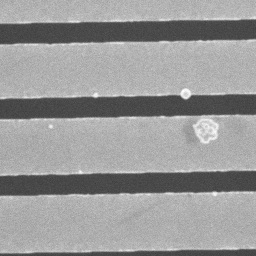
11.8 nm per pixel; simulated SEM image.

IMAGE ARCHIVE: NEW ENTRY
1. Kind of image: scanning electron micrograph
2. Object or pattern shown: lines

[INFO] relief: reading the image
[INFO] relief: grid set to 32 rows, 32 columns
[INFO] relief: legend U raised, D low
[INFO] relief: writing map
UUUUUUUUUUUUUUUUUUUUUUUUUUUUUUUU
UUUUUUUUUUUUUUUUUUUUUUUUUUUUUUUU
UUUUUUUUUUUUUUUUUUUUUUDDDDDDDDDD
DDDDDDDDDDDDDDDDDDDDDDDDDDDDDDDD
DDDDDDDDDDDDDDDDDDDDDDDDDDDDDDDD
DDDDDDDDUUUUUUUUUUUUUUUUUUUUUUUU
UUUUUUUUUUUUUUUUUUUUUUUUUUUUUUUU
UUUUUUUUUUUUUUUUUUUUUUUUUUUUUUUU
UUUUUUUUUUUUUUUUUUUUUUUUUUUUUUUU
UUUUUUUUUUUUUUUUUUUUUUUUUUUUUUUU
UUUUUUUUUUUUUUUUUUUUUUUUUUUUUUUU
UUUUUUUUUUUUUUUUUUUUUUUUUUUUUUUU
DDDDDDDDDDDDDDDDDDDDDDDDDDDDDDDD
DDDDDDDDDDDDDDDDDDDDDDDDDDDDDDDD
DDDDDDDDDDDDDDDDDDDDDDDDDUUUUUUU
UUUUUUUUUUUUUUUUUUUUUUUUUUUUUUUU
UUUUUUUUUUUUUUUUUUUUUUUUUUUUUUUU
UUUUUUUUUUUUUUUUUUUUUUUUUUUUUUUU
UUUUUUUUUUUUUUUUUUUUUUUUUUUUUUUU
UUUUUUUUUUUUUUUUUUUUUUUUUUUUUUUU
UUUUUUUUUUUUUUUUUUUUUUUUUUUUUUUU
UUUUUUUUUUUUUUUUUUDDDDDDDDDDDDDD
DDDDDDDDDDDDDDDDDDDDDDDDDDDDDDDD
DDDDDDDDDDDDDDDDDDDDDDDDDDDDDDDD
DDDDUUUUUUUUUUUUUUUUUUUUUUUUUUUU
UUUUUUUUUUUUUUUUUUUUUUUUUUUUUUUU
UUUUUUUUUUUUUUUUUUUUUUUUUUUUUUUU
UUUUUUUUUUUUUUUUUUUUUUUUUUUUUUUU
UUUUUUUUUUUUUUUUUUUUUUUUUUUUUUUU
UUUUUUUUUUUUUUUUUUUUUUUUUUUUUUUU
UUUUUUUUUUUUUUUUUUUUUUUUUUUUUUUU
UUUUUDDDDDDDDDDDDDDDDDDDDDDDDDDD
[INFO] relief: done